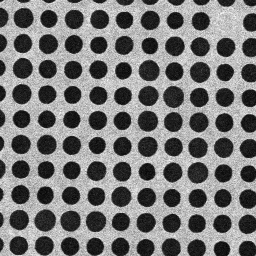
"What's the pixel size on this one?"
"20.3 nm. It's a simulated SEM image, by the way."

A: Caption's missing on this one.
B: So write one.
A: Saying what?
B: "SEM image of a regular array of holes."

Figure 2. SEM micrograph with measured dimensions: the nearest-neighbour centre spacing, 507 nm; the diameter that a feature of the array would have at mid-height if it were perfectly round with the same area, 0.379 um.